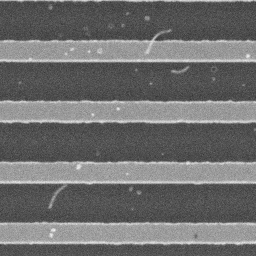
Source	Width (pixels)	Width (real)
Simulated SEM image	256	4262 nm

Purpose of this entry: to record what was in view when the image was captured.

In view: lines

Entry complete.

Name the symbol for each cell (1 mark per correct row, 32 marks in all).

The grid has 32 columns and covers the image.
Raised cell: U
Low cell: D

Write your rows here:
DDDDDDDDDDDDDDDDDDDDDDDDDDDDDDDD
DDDDDDDDDDDDDDDDDDDDDDDDDDDDDDDD
DDDDDDDDDDDDDDDDDDDDDDDDDDDDDDDD
DDDDDDDDDDDDDDDDDDDDDDDDDDDDDDDD
DDDDDDDDDDDDDDDDDDDDDDDDDDDDDDDD
UUUUUUUUUUUUUUUUUUUUUUUUUUUUUUUU
UUUUUUUUUUUUUUUUUUUUUUUUUUUUUUUU
UUUUUUUUUUUUUUUUUUUUUUUUUUUUUUUU
DDDDDDDDDDDDDDDDDDDDDDDDDDDDDDDD
DDDDDDDDDDDDDDDDDDDDDDDDDDDDDDDD
DDDDDDDDDDDDDDDDDDDDDDDDDDDDDDDD
DDDDDDDDDDDDDDDDDDDDDDDDDDDDDDDD
DDDDDDDDDDDDDDDDDDDDDDDDDDDDDDDD
UUUUUUUUUUUUUUUUUUUUUUUUUUUUUUUU
UUUUUUUUUUUUUUUUUUUUUUUUUUUUUUUU
DDDDDDDDDDDDDDDDDDDDDDDDDDDDDDDD
DDDDDDDDDDDDDDDDDDDDDDDDDDDDDDDD
DDDDDDDDDDDDDDDDDDDDDDDDDDDDDDDD
DDDDDDDDDDDDDDDDDDDDDDDDDDDDDDDD
DDDDDDDDDDDDDDDDDDDDDDDDDDDDDDDD
UUUUUUUUUUUUUUUUUUUUUUUUUUUUUUUU
UUUUUUUUUUUUUUUUUUUUUUUUUUUUUUUU
UUUUUUUUUUUUUUUUUUUUUUUUUUUUUUUU
DDDDDDDDDDDDDDDDDDDDDDDDDDDDDDDD
DDDDDDDDDDDDDDDDDDDDDDDDDDDDDDDD
DDDDDDDDDDDDDDDDDDDDDDDDDDDDDDDD
DDDDDDDDDDDDDDDDDDDDDDDDDDDDDDDD
DDDDDDDDDDDDDDDDDDDDDDDDDDDDDDDD
UUUUUUUUUUUUUUUUUUUUUUUUUUUUUUUU
UUUUUUUUUUUUUUUUUUUUUUUUUUUUUUUU
DDDDDDDDDDDDDDUDDDDDDDDDDDDDDDDD
DDDDDDDDDDDDDDDDDDDDDDDDDDDDDDDD